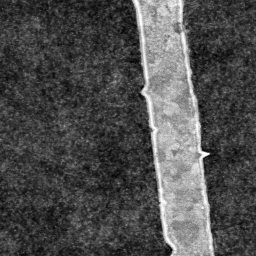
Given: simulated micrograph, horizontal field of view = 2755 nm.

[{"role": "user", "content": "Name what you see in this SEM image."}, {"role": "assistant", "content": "one or a few lines or trenches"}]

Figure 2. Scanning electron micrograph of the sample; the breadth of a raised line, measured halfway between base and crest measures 0.461 µm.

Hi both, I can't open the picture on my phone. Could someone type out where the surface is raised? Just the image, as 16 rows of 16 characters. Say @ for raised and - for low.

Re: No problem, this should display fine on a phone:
---------@@-----
---------@@-----
---------@@-----
---------@@@----
---------@@@----
---------@@@----
---------@@@----
---------@@@----
----------@@----
----------@@@---
----------@@@---
----------@@@---
----------@@@---
----------@@@---
----------@@@---
-----------@@---